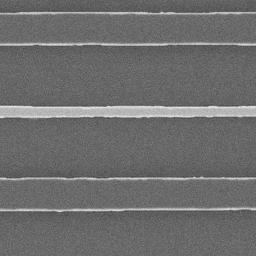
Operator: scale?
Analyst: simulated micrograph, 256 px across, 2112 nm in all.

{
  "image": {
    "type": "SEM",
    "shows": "lines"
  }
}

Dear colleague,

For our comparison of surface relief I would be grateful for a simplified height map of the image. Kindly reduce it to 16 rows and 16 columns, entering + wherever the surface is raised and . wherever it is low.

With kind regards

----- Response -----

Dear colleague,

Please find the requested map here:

................
++++++++++++++++
++++++++++++++++
................
................
................
................
................
................
................
................
++++++++++++++++
++++++++++++++++
................
................
................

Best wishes